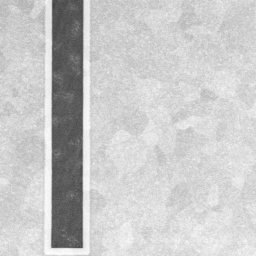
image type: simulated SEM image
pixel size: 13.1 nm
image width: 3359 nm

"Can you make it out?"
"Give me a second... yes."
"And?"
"one or a few lines or trenches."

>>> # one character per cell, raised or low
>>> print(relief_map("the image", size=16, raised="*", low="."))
***..***********
***..***********
***..***********
***..***********
***..***********
***..***********
***..***********
***..***********
***..***********
***..***********
***..***********
***..***********
***..***********
***..***********
***..***********
***..***********